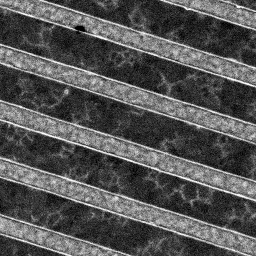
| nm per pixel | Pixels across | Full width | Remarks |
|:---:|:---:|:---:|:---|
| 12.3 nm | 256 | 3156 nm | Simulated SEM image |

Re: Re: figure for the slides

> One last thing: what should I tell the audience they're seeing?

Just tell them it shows parallel lines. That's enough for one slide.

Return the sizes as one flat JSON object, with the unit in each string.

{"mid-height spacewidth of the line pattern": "210 nanometers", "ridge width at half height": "451 nm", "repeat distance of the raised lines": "660 nm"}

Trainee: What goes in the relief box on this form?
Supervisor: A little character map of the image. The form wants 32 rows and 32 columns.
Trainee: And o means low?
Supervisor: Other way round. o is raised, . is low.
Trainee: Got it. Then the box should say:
......oooooooooooooooo.......ooo
oo........ooooooooooooooo.......
ooooo........ooooooooooooooo....
ooooooooo.......oooooooooooooooo
oooooooooooo.......ooooooooooooo
ooooooooooooooo.......oooooooooo
...ooooooooooooooo.......ooooooo
......oooooooooooooooo.......ooo
oo.......oooooooooooooooo.......
ooooo.......oooooooooooooooo....
ooooooooo.......ooooooooooooooo.
oooooooooooo.......ooooooooooooo
ooooooooooooooo.......oooooooooo
...ooooooooooooooo.......ooooooo
......ooooooooooooooo.......oooo
oo.......ooooooooooooooo.......o
ooooo.......oooooooooooooooo....
oooooooo.......oooooooooooooooo.
ooooooooooo.......oooooooooooooo
oooooooooooooo........oooooooooo
..ooooooooooooooo........ooooooo
......ooooooooooooooo.......oooo
o........ooooooooooooooo.......o
ooooo.......ooooooooooooooo.....
oooooooo.......ooooooooooooooo..
ooooooooooo.......oooooooooooooo
oooooooooooooo.......ooooooooooo
..ooooooooooooooo.......oooooooo
.....oooooooooooooooo......ooooo
o.......oooooooooooooooo.......o
oooo........ooooooo.ooooooo.....
ooooooo........ooooooooooooooo..